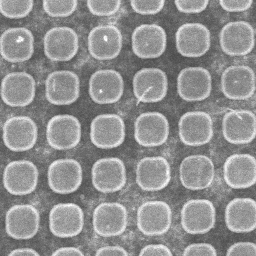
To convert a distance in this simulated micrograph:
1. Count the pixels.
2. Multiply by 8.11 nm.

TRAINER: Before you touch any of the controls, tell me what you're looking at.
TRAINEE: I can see a regular array of raised bodies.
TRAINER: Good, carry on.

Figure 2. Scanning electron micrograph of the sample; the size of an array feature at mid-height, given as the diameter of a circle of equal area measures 275 nm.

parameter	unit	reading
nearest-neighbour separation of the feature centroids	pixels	43.9